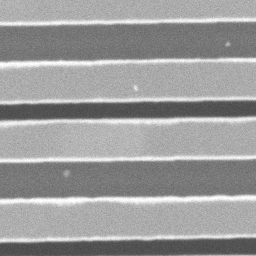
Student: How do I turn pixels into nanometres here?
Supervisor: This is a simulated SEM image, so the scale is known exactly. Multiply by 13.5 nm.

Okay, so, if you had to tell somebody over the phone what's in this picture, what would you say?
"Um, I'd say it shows lines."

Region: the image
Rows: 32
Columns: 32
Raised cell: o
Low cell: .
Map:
oooooooooooooooooooooooooooooooo
oooooooooooooooooooooooooooooooo
oooooooooooooooooooooooooooooooo
................................
................................
................................
................................
...................ooooooooooooo
oooooooooooooooooooooooooooooooo
oooooooooooooooooooooooooooooooo
oooooooooooooooooooooooooooooooo
oooooooooooooooooooooooooooooooo
oooooooooooooooooooooooooo......
................................
................................
oooooooooooooooooooooooooooooooo
oooooooooooooooooooooooooooooooo
oooooooooooooooooooooooooooooooo
oooooooooooooooooooooooooooooooo
oooooooooooooooooooooooooooooooo
................................
................................
................................
................................
...........................o..oo
oooooooooooooooooooooooooooooooo
oooooooooooooooooooooooooooooooo
oooooooooooooooooooooooooooooooo
oooooooooooooooooooooooooooooooo
oooooooooooooooooooooooooooooooo
................................
................................